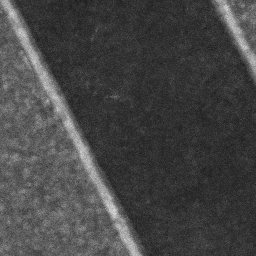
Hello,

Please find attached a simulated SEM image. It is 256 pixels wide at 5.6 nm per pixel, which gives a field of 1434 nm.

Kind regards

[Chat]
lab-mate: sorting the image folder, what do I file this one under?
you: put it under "one or a few lines or trenches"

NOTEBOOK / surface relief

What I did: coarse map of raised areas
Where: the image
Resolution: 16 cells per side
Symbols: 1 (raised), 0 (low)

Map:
1000000000000011
1000000000000001
1100000000000001
1100000000000000
1110000000000000
1110000000000000
1111000000000000
1111000000000000
1111100000000000
1111100000000000
1111110000000000
1111110000000000
1111111000000000
1111111000000000
1111111100000000
1111111100000000